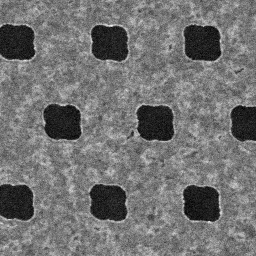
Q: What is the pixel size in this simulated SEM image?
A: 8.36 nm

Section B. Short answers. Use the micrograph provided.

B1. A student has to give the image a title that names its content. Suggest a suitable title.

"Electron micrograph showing holes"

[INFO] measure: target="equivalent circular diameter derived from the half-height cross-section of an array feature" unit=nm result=332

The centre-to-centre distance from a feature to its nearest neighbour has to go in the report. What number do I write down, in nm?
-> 772